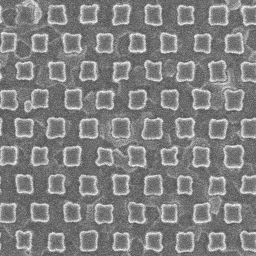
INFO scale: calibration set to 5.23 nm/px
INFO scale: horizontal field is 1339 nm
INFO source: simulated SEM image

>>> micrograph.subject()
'a regular array of raised bodies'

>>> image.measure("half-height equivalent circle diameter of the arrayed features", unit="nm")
101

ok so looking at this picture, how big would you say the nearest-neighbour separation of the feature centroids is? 0.165 µm